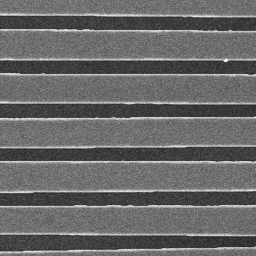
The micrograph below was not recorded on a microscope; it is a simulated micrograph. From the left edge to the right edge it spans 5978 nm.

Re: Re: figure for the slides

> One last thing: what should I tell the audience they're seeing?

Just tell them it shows lines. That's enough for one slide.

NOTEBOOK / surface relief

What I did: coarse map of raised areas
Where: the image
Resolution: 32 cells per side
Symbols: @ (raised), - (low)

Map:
@@@@@@@@@@@@@@@@@@@@@@@@@@@@@@@@
@@@@@@@@@@@@@@@@@@@@@@@@@@@@@@@@
--------------------------------
--------------------------------
@@@@@@@@@@@@@@@@@@@@@@@@@@@@@@@@
@@@@@@@@@@@@@@@@@@@@@@@@@@@@@@@@
@@@@@@@@@@@@@@@@@@@@@@@@@@@@@@@@
----------------------------@---
--------------------------------
@@@@@@@@@@@@@@@@@@@@@@@@@@@@@@@@
@@@@@@@@@@@@@@@@@@@@@@@@@@@@@@@@
@@@@@@@@@@@@@@@@@@@@@@@@@@@@@@@@
@@@@@@@@@@@@@@@@@@@@@@@@@@@@@@@@
--------------------------------
--------------------------------
@@@@@@@@@@@@@@@@@@@@@@@@@@@@@@@@
@@@@@@@@@@@@@@@@@@@@@@@@@@@@@@@@
@@@@@@@@@@@@@@@@@@@@@@@@@@@@@@@@
--------------------------------
--------------------------------
@@@@@@@@@@@@@@@@@@@@@@@@@@@@@@@@
@@@@@@@@@@@@@@@@@@@@@@@@@@@@@@@@
@@@@@@@@@@@@@@@@@@@@@@@@@@@@@@@@
@@@@@@@@@@@@@@@@@@@@@@@@@@@@@@@@
--------------------------------
--------------------------------
@@@@@@@@@@@@@@@@@@@@@@@@@@@@@@@@
@@@@@@@@@@@@@@@@@@@@@@@@@@@@@@@@
@@@@@@@@@@@@@@@@@@@@@@@@@@@@@@@@
--------------------------------
--------------------------------
---@@@@@@@@@@@@@@@@@@@@@@@@@@@@@